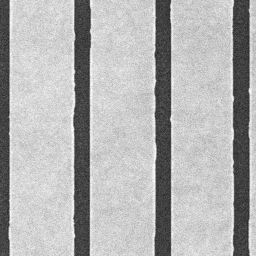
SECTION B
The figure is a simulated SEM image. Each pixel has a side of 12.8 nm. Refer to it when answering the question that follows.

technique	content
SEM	lines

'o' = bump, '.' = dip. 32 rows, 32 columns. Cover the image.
.oooooooo..oooooooo..oooooooo..o
.oooooooo..oooooooo..oooooooo..o
.oooooooo..oooooooo..oooooooo..o
.oooooooo..oooooooo..oooooooo..o
.oooooooo..oooooooo..oooooooo..o
.oooooooo..oooooooo..oooooooo..o
.oooooooo..oooooooo..oooooooo..o
.oooooooo..oooooooo..oooooooo..o
.oooooooo..oooooooo..oooooooo..o
.oooooooo..oooooooo..oooooooo..o
.oooooooo..oooooooo..oooooooo..o
.oooooooo..oooooooo..oooooooo..o
.oooooooo..oooooooo..oooooooo..o
.oooooooo..oooooooo..oooooooo..o
.oooooooo..oooooooo..oooooooo..o
.oooooooo..oooooooo..oooooooo..o
.oooooooo..oooooooo..oooooooo..o
.oooooooo..oooooooo..oooooooo..o
.oooooooo..oooooooo..oooooooo..o
.oooooooo..oooooooo..oooooooo..o
.oooooooo..oooooooo..oooooooo..o
.oooooooo..oooooooo..oooooooo..o
.oooooooo..oooooooo..oooooooo..o
.oooooooo..oooooooo..oooooooo..o
.oooooooo..oooooooo..oooooooo..o
.oooooooo..oooooooo..oooooooo..o
.oooooooo..oooooooo..oooooooo..o
.oooooooo..oooooooo..oooooooo..o
.oooooooo..oooooooo..oooooooo..o
.oooooooo..oooooooo..oooooooo..o
.oooooooo..oooooooo..oooooooo..o
.oooooooo..oooooooo..oooooooo..o